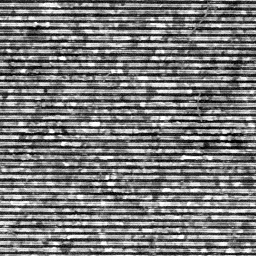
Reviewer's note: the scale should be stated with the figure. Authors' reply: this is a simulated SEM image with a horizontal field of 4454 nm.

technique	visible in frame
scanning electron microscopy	parallel lines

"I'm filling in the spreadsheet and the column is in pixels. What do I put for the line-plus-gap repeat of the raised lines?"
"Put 6.62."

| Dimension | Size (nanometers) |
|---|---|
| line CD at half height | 47.9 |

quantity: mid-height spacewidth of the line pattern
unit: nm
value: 60.9